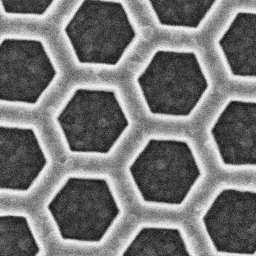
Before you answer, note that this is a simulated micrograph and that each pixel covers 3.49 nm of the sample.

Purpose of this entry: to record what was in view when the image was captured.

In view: holes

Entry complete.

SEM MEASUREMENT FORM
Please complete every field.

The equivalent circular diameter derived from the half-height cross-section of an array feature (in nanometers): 234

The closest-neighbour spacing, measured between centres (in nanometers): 309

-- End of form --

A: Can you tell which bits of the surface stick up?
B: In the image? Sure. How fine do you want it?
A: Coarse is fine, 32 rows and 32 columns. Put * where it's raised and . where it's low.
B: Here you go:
......****.....****........*****
*.....***.......***.......******
*********.......****.....****...
********.........***********....
********.........***********....
.....****.......***********.....
......***.......****....****....
......****.....****......***....
.......***********.......****...
.......**********.........****..
......***********.........******
.....****.....****........******
.....****......***.......*******
********.......****.....****....
*******.........*****..****.....
*******.........***********.....
....****.......***********......
.....***.......****...*****.....
.....****.....****......***.....
......***********.......****....
......**********.........***....
.....***********.........*******
.....***.....****........*******
....***.......***.......********
*******.......****.....****.....
******.........*****..****......
******.........***********......
...****.......***********.......
....***.......****..******......
....****.....****......***......
.....***********.......****.....
.....**********.........***.....